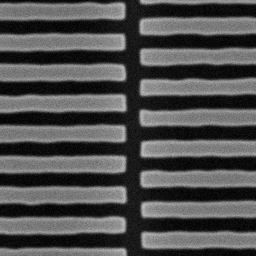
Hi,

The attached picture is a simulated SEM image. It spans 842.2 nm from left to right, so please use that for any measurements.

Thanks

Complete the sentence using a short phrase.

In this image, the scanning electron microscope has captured groups of lines, slits or small figures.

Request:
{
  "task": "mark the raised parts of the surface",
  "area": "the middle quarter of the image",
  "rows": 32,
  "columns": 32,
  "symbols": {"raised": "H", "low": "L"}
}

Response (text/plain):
HHHHHHHHHHHHHHHLLLLLLLLLLLLLLLLL
HHHHHHHHHHHHHHHLLLLLLLLLLLLLLLLL
HHHHHHHHHHHHHHHLLLLLLLLLLLLLLLLL
HHHHHHHHHHHHHHHLLLLLLLLLLLLLLLLL
LLLLLLLLLLLLLLLLLLLHHHHHHHHHHHHH
LLLLLLLLLLLLLLLLLLLHHHHHHHHHHHHH
LLLLLLLLLLLLLLLLLLLHHHHHHHHHHHHH
LLLLLLLLLLLLLLLLLLLHHHHHHHHHHHHH
HHHHHHHHHHHHHHHLLLLLLLLLLLLLLLLL
HHHHHHHHHHHHHHHLLLLLLLLLLLLLLLLL
HHHHHHHHHHHHHHHLLLLLLLLLLLLLLLLL
HHLHHHHHHHHHLHHLLLLLLLLLLLLLLLLL
LLLLLLLLLLLLLLLLLLLHHHHHHHHHHHHH
LLLLLLLLLLLLLLLLLLLHHHHHHHHHHHHH
LLLLLLLLLLLLLLLLLLLHHHHHHHHHHHHH
LLLLLLLLHHHHLLLLLLLLLLLLLLLLLLLL
HHHHHHHHHHHHHHHLLLLLLLLLLLLLLLLL
HHHHHHHHHHHHHHHLLLLLLLLLLLLLLLLL
HHHHHHHHHHHHHHHLLLLLLLLLLLLLLLLL
LLLLLLLLLLLLLLLLLLLLLHHHHHHHHHHH
LLLLLLLLLLLLLLLLLLLHHHHHHHHHHHHH
LLLLLLLLLLLLLLLLLLLHHHHHHHHHHHHH
LLLLLLLLLLLLLLLLLLLHHHHHHHHHHHHH
HHHHHHHHHHHHHHHLLLLLLLLLLLLLLLLL
HHHHHHHHHHHHHHHLLLLLLLLLLLLLLLLL
HHHHHHHHHHHHHHHLLLLLLLLLLLLLLLLL
HHHHHHHHHHHHHHHLLLLLLLLLLLLLLLLL
LLLLLLLLLLLLLLLLLLLHHHHHHHHHHHHH
LLLLLLLLLLLLLLLLLLLHHHHHHHHHHHHH
LLLLLLLLLLLLLLLLLLLHHHHHHHHHHHHH
LLLLLLLLLLLLLLLLLLLLHHHLLLLLLLLL
HHHHHHHHHHHHHHHLLLLLLLLLLLLLLLLL